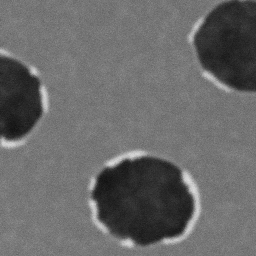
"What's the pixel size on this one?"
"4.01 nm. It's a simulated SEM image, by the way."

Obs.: holes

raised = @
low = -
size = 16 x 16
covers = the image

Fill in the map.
@@@@@@@@@@@@@---
@@@@@@@@@@@@@---
@@@@@@@@@@@@----
@@@@@@@@@@@@----
--@@@@@@@@@@@---
---@@@@@@@@@@@--
---@@@@@@@@@@@@@
--@@@@@@@@@@@@@@
-@@@@@@@@@@@@@@@
@@@@@@@@@@@@@@@@
@@@@@@@----@@@@@
@@@@@@------@@@@
@@@@@@------@@@@
@@@@@@------@@@@
@@@@@@@----@@@@@
@@@@@@@@@@@@@@@@